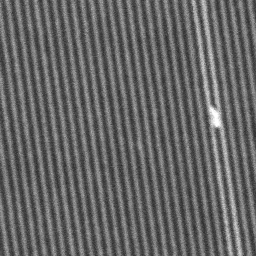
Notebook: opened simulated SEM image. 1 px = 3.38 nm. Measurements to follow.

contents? parallel lines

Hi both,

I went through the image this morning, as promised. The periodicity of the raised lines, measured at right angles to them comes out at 31.1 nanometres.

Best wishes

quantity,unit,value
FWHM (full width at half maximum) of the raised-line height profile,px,2.57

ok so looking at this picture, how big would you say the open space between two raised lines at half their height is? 20.4 nm